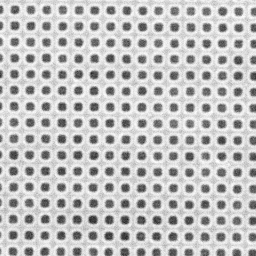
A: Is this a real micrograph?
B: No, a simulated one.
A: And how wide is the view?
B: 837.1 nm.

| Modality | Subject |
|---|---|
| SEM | a regular array of holes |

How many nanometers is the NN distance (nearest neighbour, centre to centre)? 51.6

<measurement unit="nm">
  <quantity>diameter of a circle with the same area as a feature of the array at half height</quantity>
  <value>34.6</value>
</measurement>